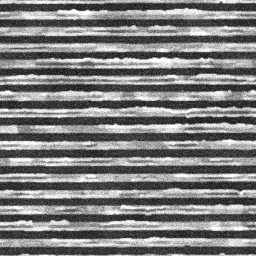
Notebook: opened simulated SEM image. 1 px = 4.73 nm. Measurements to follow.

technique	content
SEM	parallel lines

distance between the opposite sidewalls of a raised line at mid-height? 0.036 µm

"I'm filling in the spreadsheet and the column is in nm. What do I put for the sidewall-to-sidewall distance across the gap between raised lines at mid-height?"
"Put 40.8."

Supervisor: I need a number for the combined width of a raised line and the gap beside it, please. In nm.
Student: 76.8